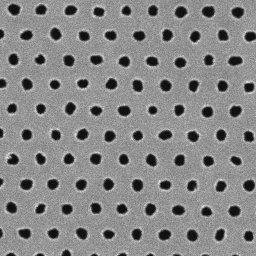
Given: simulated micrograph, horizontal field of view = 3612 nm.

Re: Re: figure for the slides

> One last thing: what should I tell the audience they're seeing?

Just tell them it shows a regular array of holes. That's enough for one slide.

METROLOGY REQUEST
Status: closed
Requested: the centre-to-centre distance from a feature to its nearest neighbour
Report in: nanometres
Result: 383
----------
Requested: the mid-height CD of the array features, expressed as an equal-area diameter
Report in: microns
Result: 0.159